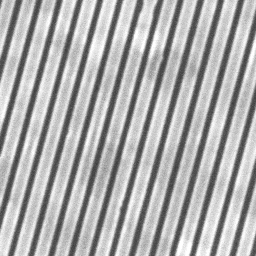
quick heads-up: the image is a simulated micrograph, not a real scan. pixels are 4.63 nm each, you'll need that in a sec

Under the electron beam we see parallel lines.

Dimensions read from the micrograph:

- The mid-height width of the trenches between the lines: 34.1 nanometres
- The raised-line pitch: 0.0902 um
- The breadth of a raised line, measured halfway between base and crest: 55.9 nm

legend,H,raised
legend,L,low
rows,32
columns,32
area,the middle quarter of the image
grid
HHHHLLHHHLLHHHLLHHHLLHHHLLHHHLLH
HHHLLHHHLLHHHLLHHHLLHHHLLHHHHLHH
HHHLLHHHLLHHHLLHHHLLHHHLLHHHLLHH
HHHLLHHHLLHHHLLHHHLLHHHLLHHHLLHH
HHLLHHHHLHHHHLLHHHLLHHHLLHHHLLHH
HHLLHHHLLHHHLLHHHLLHHHLLHHHLLHHH
HHLLHHHLLHHHLLHHHLLHHHLLHHHLLHHH
HHLLHHHLLHHHLLHHHLLHHHLLHHHLLHHH
HLLHHHLLHHHLLHHHHLLHHHLLHHHLLHHH
HLLHHHLLHHHLLHHHLLHHHLLHHHLLHHHL
HLLHHHLLHHHLLHHHLLHHHLLHHHLLHHHL
HLLHHHLLHHHLLHHHLLHHHLLHHHLLHHHL
LLHHHLLHHHLLHHHLLHHHLLHHHHLLHHHL
LLHHHLLHHHLLHHHLLHHHLLHHHLLHHHLL
LLHHHLLHHHLLHHHLLHHHLLHHHLLHHHLL
LHHHHLLHHHLLHHHLLHHHLLHHHLLHHHLL
LHHHLLHHHLLHHHLLHHHLLHHHLLHHHHLH
LHHHLLHHHLLHHHLLHHHLLHHHLLHHHLLH
LHHHLLHHHLLHHHLLHHHLLHHHLLHHHLLH
HHHLLHHHHLHHHHLLHHHLLHHHLLHHHLLH
HHHLLHHHLLHHHLLHHHLLHHHLLHHHLLHH
HHHLLHHHLLHHHLLHHHLLHHHLLHHHLLHH
HHHLLHHHLLHHHLLHHHLLHHHLLHHHLLHH
HHLLHHHLLHHHLLHHHHLHHHHLLHHHLLHH
HHLLHHHLLHHHLLHHHLLHHHLLHHHLLHHH
HHLLHHHLLHHHLLHHHLLHHHLLHHHLLHHH
HHLLHHHLLHHHLLHHHLLHHHLLHHHLLHHH
HLLHHHLLHHHLLHHHLLHHHLLHHHHLLHHH
HLLHHHLLHHHLLHHHLLHHHLLHHHLLHHHL
HLLHHHLLHHHLLHHHLLHHHLLHHHLLHHHL
HLHHHHLLHHHLLHHHLLHHHLLHHHLLHHHL
LLHHHLLHHHLLHHHLLHHHLLHHHLLHHHLL